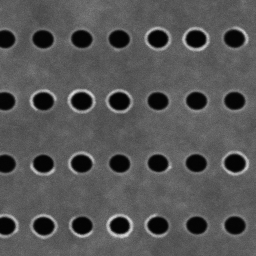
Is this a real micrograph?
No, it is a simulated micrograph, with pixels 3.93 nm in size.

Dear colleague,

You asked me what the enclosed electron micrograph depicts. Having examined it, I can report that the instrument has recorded a regular array of holes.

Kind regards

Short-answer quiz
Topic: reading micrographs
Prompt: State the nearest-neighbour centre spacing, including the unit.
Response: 150 nm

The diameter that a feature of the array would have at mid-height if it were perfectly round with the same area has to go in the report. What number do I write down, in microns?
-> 0.0732